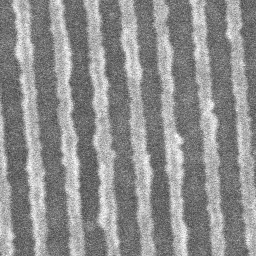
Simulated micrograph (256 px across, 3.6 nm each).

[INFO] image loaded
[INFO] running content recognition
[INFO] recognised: parallel lines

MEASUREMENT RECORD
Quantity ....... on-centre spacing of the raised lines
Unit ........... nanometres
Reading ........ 127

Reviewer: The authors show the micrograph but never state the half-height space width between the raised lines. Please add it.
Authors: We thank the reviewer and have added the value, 80.3 nm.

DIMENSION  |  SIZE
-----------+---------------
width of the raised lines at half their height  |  44.8 nanometers